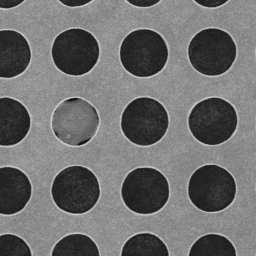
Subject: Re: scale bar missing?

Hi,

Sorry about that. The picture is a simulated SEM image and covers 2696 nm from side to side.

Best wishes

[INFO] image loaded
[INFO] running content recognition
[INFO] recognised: a regular array of holes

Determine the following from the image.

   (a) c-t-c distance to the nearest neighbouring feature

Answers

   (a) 68.1 px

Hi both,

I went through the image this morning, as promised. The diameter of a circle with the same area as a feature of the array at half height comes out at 504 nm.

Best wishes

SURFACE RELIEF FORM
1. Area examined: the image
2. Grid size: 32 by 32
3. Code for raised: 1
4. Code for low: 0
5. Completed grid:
00111111000111110001111110001111
11111111111111111111111111111111
11111111111111111111111111111111
11111111111111111111111111111111
00011110000011110000111100000111
00001110000011100000011100000111
00001100000011100000011100000011
00001110000011100000011100000111
00011110000011110000111100000111
00111111111111111001111111011111
11111111111111111111111111111111
11111111111111111111111111111111
00111111001111111001111110001111
00011110000011110000011100000111
00001110000011100000011100000011
00001100000011100000011100000011
00011110000011100000011100000111
00011111000111110000111110001111
11111111111111111111111111111111
11111111111111111111111111111111
11111111111111111111111111111111
00011111000111110000111100000111
00001110000011110000011100000111
00001100000011100000011000000111
00001100000011100000011100000111
00011110000011110000011100000111
00111111000111111001111111011111
11111111111111111111111111111111
11111111111111111111111111111111
00111111000111111001111110001111
00011110000011110000011100000111
00001110000011100000011100000111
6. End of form